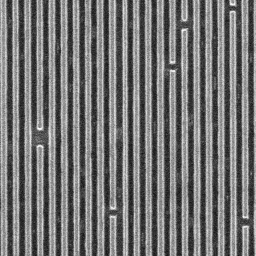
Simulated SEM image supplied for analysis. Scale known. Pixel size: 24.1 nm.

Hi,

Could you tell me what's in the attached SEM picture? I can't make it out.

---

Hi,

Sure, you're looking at parallel lines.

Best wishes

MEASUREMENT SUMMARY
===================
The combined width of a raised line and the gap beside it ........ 290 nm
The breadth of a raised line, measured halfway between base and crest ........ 0.126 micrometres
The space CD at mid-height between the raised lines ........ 7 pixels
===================